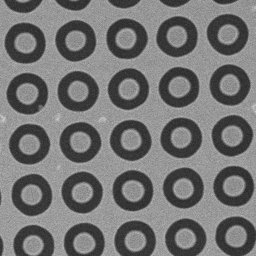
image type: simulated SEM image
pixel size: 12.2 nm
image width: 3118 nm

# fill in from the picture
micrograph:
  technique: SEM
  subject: an array of small figures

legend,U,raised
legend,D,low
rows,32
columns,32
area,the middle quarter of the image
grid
UUUUUUUUUUUUUUUUUUUUUUUUUUUUUUUU
UUUUUUUUUUUUUUDDDDDUUUUUUUDDDDDD
UDDDDDUUUUUUUDDDDDDDUUUUUDDDDDDD
DDDDDDDUUUUUDDDDDDDDDUUUDDDDUUDD
DDDUDDDDUUUDDDDUUUDDDUUUDDDUUUUD
DDUUUDDDDUUDDDUUUUUDDUUUDDUUUUUD
DUUUUUDDDUUDDDUUUUUDDUUUDDUUUUUD
DUUUUUDDDUUDDDUUUUDDDUUUDDDUUUDD
DDUUUDDDDUUDDDDUUDDDDUUUDDDDDDDD
DDDDDDDDUUUUDDDDDDDDUUUUUDDDDDDD
DDDDDDDUUUUUUDDDDDDUUUUUUUDDDDDU
UDDDDDUUUUUUUUUDDUUUUUUUUUUUUUUU
UUUUUUUUUUUUUUUUUUUUUUUUUUUUUUUU
UUUUUUUUUUUUUUUUUUUUUUUUUUUUDDDU
UUUDDDUUUUUUUUDDDDDUUUUUUUDDDDDD
UDDDDDDUUUUUUDDDDDDDUUUUUDDDDDDD
DDDDDDDDUUUUDDDDDDDDDUUUDDDDUUUD
DDDUUDDDDUUUDDDUUUUDDDUUDDDUUUUU
DDUUUUDDDUUDDDDUUUUDDDUUDDDUUUUU
DDUUUUUDDDUDDDDUUUUDDDUUDDDUUUUD
DDUUUUDDDUUUDDDUUUUDDDUUDDDDUUDD
DDDUUDDDDUUUDDDDDDDDDDUUUDDDDDDD
DDDDDDDDUUUUUDDDDDDDDUUUUUDDDDDD
UDDDDDDDUUUUUUDDDDDUUUUUUUUUDDDU
UUDDDDUUUUUUUUUUUUUUUUUUUUUUUUUU
UUUUUUUUUUUUUUUUUUUUUUUUUUUUUUUU
UUUUUUUUUUUUUUUUDDUUUUUUUUUDDDDD
UUDDDDDUUUUUUUDDDDDDUUUUUUDDDDDD
UDDDDDDDUUUUUDDDDDDDDUUUUDDDDDDD
DDDDDDDDDUUUDDDDUUDDDDUUUDDDUUUU
DDDUUUDDDDUUDDDUUUUUDDUUUDDDUUUU
DDUUUUUDDDUUDDDUUUUUDDUUUDDUUUUU